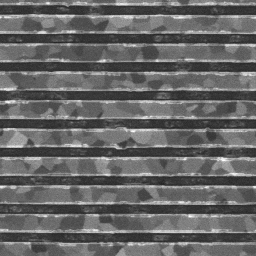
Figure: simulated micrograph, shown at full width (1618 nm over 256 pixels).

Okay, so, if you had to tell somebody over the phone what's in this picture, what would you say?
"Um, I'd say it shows parallel lines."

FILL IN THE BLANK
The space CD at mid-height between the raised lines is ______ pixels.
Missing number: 10.5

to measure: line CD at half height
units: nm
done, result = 112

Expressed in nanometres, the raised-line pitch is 180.